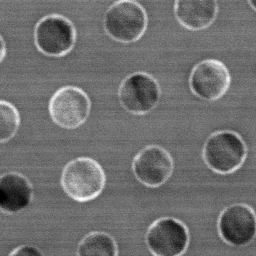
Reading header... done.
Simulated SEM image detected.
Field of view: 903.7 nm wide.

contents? raised bodies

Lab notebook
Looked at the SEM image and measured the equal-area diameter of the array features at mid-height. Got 142 nm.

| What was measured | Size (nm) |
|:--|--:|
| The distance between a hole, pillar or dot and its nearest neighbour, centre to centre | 251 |